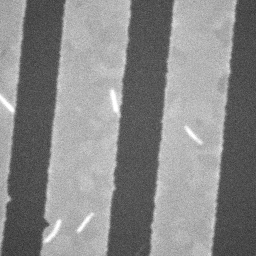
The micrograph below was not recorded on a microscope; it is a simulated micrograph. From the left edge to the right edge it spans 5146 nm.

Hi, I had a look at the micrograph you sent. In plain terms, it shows one or a few lines or trenches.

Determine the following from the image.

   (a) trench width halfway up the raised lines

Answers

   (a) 0.853 microns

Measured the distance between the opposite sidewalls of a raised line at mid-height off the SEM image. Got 1240 nm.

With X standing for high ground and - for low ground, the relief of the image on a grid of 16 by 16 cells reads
XX--XXXX---XXXX-
X---XXXX---XXXX-
X---XXXX---XXX--
X---XXXX---XXX--
X---XXXX--XXXX--
X---XXXX--XXXX--
X---XXXX--XXXX--
X--XXXX---XXXX--
X--XXXX---XXXX--
X--XXXX---XXXX--
X--XXXX---XXXX--
---XXXX---XXXX--
---XXXX---XXXX--
---XXXX---XXX---
---XXXX---XXX---
---XXXX--XXXX---